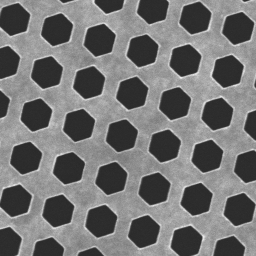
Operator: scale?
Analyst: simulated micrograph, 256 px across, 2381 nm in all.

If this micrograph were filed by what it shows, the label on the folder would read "a regular array of holes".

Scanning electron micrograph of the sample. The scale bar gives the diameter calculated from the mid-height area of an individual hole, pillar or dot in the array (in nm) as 289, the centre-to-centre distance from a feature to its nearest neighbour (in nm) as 406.